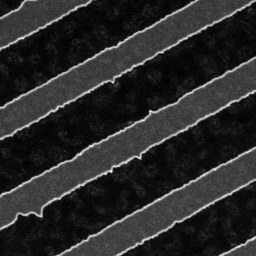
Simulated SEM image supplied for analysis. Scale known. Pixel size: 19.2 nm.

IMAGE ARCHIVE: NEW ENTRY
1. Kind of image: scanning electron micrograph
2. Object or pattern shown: one or a few lines or trenches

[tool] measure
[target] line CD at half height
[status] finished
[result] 0.557 microns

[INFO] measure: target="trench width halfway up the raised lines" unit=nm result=951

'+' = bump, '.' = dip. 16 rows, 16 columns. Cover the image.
.++++......++++.
+++.......+++...
+.......+++.....
......++++......
....++++......++
..++++......++++
++++.......+++..
++.......++++...
+......++++.....
.....++++......+
...++++......+++
.++++.......++++
+++.......++++..
+.......++++....
......++++......
....++++.......+